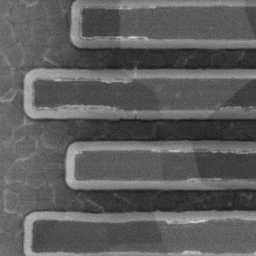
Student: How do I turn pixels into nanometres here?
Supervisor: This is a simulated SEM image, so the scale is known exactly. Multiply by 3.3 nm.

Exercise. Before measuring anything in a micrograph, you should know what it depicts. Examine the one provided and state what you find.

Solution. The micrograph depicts one or a few lines or trenches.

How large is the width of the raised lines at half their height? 0.14 microns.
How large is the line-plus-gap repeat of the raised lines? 0.234 um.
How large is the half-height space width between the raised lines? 0.0964 µm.